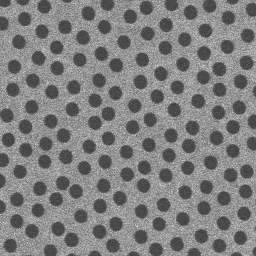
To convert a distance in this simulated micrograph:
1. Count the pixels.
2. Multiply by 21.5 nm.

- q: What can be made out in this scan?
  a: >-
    a regular array of holes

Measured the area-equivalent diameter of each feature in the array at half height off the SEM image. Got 0.296 microns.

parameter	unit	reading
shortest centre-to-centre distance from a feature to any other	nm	447